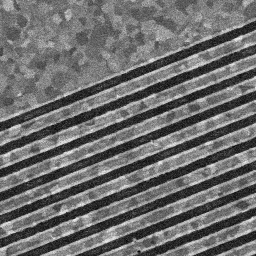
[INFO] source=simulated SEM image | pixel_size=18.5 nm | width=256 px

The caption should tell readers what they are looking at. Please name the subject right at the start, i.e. parallel lines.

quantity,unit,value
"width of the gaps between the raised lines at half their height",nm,198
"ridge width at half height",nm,198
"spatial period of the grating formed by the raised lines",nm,399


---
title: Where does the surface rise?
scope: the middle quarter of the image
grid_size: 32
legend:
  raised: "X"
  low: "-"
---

XXXXXXXXXXXXXXXXXXX-------XXXXXX
XXXXXXXXXXXXXXXX--------XXXXXXX-
XXXXXXXXXXXXXX-------XXXXXXXX---
XXXXXXXXXXX--------XXXXXXX------
XXXXXXXXX-------XXXXXXXX------XX
XXXXXX-------XXXXXXXX-------XXXX
XXXX-------XXXXXXXX------XXXXXXX
X-------XXXXXXXX-------XXXXXXXX-
------XXXXXXX-------XXXXXXXX----
---XXXXXXXX-------XXXXXXXX------
-XXXXXXXX-------XXXXXXX-------XX
XXXXXX-------XXXXXXXX------XXXXX
XXXX------XXXXXXXX-------XXXXXXX
X-------XXXXXXXX------XXXXXXXX--
-----XXXXXXXX-------XXXXXXX-----
---XXXXXXXX------XXXXXXXX-------
XXXXXXXX-------XXXXXXX--------XX
XXXXXX-------XXXXXXX-------XXXXX
XXX-------XXXXXXX--------XXXXXXX
-------XXXXXXXX-------XXXXXXX---
-----XXXXXXX--------XXXXXXX-----
--XXXXXXXX-------XXXXXXXX-------
XXXXXXX-------XXXXXXXX-------XXX
XXXXX-------XXXXXXXX-------XXXXX
XX--------XXXXXXX-------XXXXXXXX
-------XXXXXXX--------XXXXXXX---
-----XXXXXXX-------XXXXXXXX-----
--XXXXXXX--------XXXXXXX-------X
XXXXXXX-------XXXXXXXX------XXXX
XXXX--------XXXXXXX-------XXXXXX
XX-------XXXXXXXX------XXXXXXXX-
-------XXXXXXX-------XXXXXXXX---